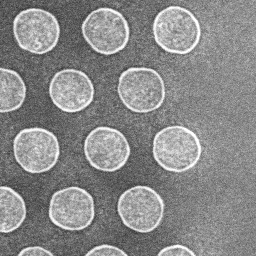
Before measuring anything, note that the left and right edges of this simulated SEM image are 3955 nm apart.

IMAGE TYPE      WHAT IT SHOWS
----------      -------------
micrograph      a regular array of raised bodies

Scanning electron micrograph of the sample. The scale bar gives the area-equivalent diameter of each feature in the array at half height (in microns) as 0.687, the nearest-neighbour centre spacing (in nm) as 1060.